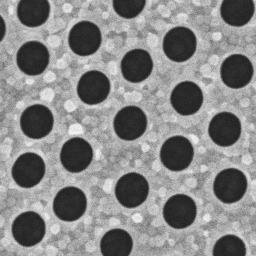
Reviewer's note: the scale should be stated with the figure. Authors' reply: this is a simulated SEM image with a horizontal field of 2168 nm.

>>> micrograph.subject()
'a regular array of holes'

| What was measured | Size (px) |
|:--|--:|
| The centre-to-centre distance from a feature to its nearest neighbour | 49.4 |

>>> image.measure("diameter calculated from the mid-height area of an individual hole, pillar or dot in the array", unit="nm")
291